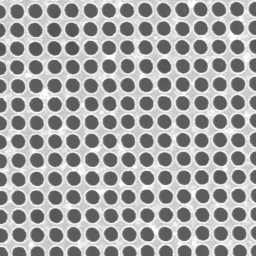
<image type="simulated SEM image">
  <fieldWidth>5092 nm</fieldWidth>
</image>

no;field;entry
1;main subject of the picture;a regular array of holes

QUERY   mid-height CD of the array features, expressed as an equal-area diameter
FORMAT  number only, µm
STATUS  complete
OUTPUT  0.296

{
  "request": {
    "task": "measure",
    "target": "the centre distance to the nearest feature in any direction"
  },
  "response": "360 nm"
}